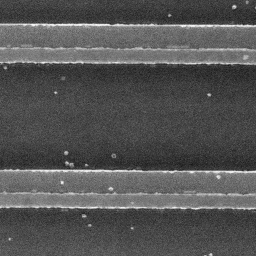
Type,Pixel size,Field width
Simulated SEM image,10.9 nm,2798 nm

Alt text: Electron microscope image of lines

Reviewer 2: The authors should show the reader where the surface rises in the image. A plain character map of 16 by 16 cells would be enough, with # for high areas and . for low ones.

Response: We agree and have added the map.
................
................
################
################
................
................
................
................
................
................
................
################
################
................
................
................